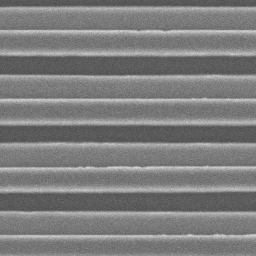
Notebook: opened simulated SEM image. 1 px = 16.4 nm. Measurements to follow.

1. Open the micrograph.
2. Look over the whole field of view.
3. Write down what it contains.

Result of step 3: lines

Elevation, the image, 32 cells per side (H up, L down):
LLLLLLLLLLLLLLLLLLLLLLLLLLLLLLLL
HHHHHHHHHHHHHHHHHHHHHHHHHHHHHHHH
HHHHHHHHHHHHHHHHHHHHHHHHHHHHHHHH
HHHHHHHHHHHHHHHHHHHHHHHHHHHHHHHH
HHHHHHHHHHHHHHHHHHHHHHHHHHHHHHHH
HHHHHHHHHHHHHHHHHHHHHHHHHHHHHHHH
HHHHHHHHHHHHHHHHHHHHHHHHHHHHHHHH
LLLLLLLLLLLLLLLLLLLLLLLLLLLLLLLL
LLLLLLLLLLLLLLLLLLLLLLLLLLLLLLLL
HHHHHHHHHHHLLLLHHLLLLLHLLHHHLLLL
HHHHHHHHHHHHHHHHHHHHHHHHHHHHHHHH
HHHHHHHHHHHHHHHHHHHHHHHHHHHHHHHH
HHHHHHHHHHHHHHHHHHHHHHHHHHHHHHHH
HHHHHHHHHHHHHHHHHHHHHHHHHHHHHHHH
HHHHHHHHHHHHHHHHHHHHHHHHHHHHHHHH
LLLLLLLLLLLLLLLLLLLLLLLLLLLLLLLL
LLLLLLLLLLLLLLLLLLLLLLLLLLLLLLLL
LLLLLLLLLLLLLLLLLLLLLLLLLLLLLLLL
HHHHHHHHHHHHHHHHHHHHHHHHHHHHHHHH
HHHHHHHHHHHHHHHHHHHHHHHHHHHHHHHH
HHHHHHHHHHHHHHHHHHHHHHHHHHHHHHHH
HHHHHHHHHHHHHHHHHHHHHHHHHHHHHHHH
HHHHHHHHHHHHHHHHHHHHHHHHHHHHHHHH
HHHHHHHHHHHHHHHHHHHHHHHHHHHHHHHH
LLLLLLLLLLLLLLLLLLLLLLLLLLLLLLLL
LLLLLLLLLLLLLLLLLLLLLLLLLLLLLLLL
LLLLLLLLLLLLLLLLLLLLLLLLLLLLLLLL
HHHHHHHHHHHHHHHHHHHHHHHHHHHHHHHH
HHHHHHHHHHHHHHHHHHHHHHHHHHHHHHHH
HHHHHHHHHHHHHHHHHHHHHHHHHHHHHHHH
HHHHHHHHHHHHHHHHHHHHHHHHHHHHHHHH
HHHHHHHHHHHHHHHHHHHHHHHHHHHHHHHH